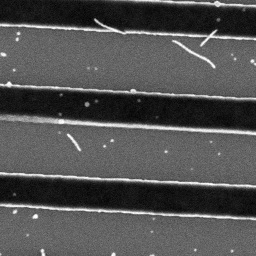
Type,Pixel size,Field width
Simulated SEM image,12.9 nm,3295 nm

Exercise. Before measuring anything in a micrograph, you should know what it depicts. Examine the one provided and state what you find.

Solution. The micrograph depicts lines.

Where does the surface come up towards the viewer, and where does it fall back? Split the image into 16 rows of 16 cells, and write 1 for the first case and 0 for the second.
1111111111111111
1111111111111111
0000000000000000
0000000000000000
0000000000000000
1111000000000000
1111111111111111
0011111111111111
0000000000000000
0000000000000000
0000000000000000
1111111111111000
1111111111111111
0000000000001111
0000000000000000
0000000000000000